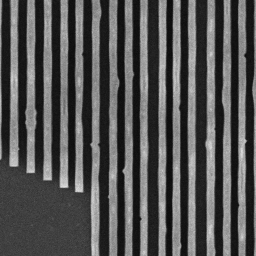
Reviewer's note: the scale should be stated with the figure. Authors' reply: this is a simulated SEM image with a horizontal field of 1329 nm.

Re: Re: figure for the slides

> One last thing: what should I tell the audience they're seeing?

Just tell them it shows parallel lines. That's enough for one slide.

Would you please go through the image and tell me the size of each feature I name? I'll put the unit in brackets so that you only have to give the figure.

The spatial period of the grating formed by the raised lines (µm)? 0.0845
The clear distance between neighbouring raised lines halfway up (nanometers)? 45.4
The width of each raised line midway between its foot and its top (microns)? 0.0409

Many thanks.